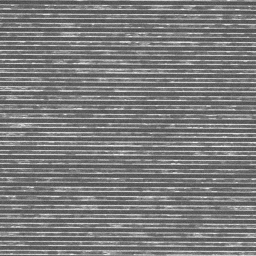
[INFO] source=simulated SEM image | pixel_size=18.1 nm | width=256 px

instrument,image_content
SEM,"parallel lines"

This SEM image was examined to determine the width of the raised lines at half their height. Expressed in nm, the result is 76.8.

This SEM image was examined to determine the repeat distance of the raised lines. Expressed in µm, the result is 0.164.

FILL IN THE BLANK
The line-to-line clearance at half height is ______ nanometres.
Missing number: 85.9